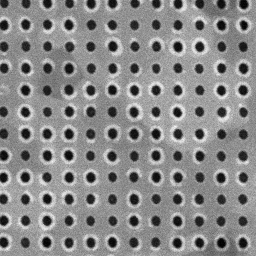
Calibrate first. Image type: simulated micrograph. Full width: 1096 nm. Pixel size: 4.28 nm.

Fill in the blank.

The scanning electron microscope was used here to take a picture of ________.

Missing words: a regular array of holes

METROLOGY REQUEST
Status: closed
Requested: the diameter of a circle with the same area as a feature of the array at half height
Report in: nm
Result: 44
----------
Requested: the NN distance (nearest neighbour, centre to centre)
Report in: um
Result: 0.0916